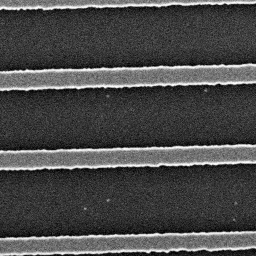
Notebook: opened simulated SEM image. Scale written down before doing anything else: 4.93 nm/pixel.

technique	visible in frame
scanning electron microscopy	lines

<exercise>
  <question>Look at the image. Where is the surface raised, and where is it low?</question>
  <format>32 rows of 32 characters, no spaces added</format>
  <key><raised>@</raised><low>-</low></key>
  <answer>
@@@@@@@@@@@@@@@@@@@@@@@@@@@@----
--------------------------------
--------------------------------
--------------------------------
--------------------------------
--------------------------------
--------------------------------
--------------------------------
------------------@@@@@@@@@@@@@@
@@@@@@@@@@@@@@@@@@@@@@@@@@@@@@@@
@@@@@@@@@@@@@@@@@@@@@@@@@@@@@@--
--------------------------------
--------------------------------
--------------------------------
--------------------------------
--------------------------------
--------------------------------
--------------------------------
------------------@@@@@@@@@@@@@@
@@@@@@@@@@@@@@@@@@@@@@@@@@@@@@@@
@@@@@@@@@@@@@@@@@@@@@@@@@-@@----
--------------------------------
--------------------------------
--------------------------------
--------------------------------
--------------------------------
--------------------------------
--------------------------------
--------------------------------
-----------@@@@@@@@@@@@@@@@@@@@@
@@@@@@@@@@@@@@@@@@@@@@@@@@@@@@@@
@@@@@@@@@@@@@@@---@-------------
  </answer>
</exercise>